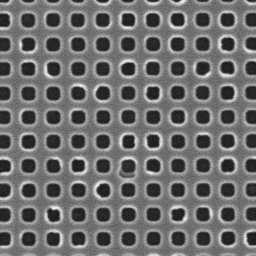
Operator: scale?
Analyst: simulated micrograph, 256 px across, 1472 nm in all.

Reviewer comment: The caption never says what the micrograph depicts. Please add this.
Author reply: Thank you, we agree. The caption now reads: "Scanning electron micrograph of a regular array of holes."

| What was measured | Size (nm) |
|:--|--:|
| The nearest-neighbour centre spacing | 139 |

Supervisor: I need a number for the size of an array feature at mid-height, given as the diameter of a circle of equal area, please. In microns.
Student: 0.0871